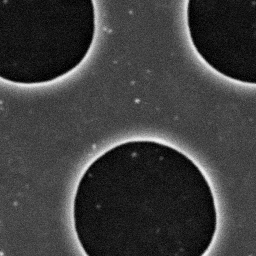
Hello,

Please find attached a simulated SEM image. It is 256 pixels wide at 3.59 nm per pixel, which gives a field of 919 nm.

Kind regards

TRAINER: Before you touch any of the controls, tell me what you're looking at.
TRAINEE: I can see holes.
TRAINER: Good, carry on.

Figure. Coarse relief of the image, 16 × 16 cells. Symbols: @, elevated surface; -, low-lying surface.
------@@@@@@----
------@@@@@@----
------@@@@@@----
-----@@@@@@@@---
----@@@@@@@@@@--
@@@@@@@@@@@@@@@@
@@@@@@@@@@@@@@@@
@@@@@@@@@@@@@@@@
@@@@@@@@@@@@@@@@
@@@@@@@----@@@@@
@@@@@-------@@@@
@@@@@--------@@@
@@@@@--------@@@
@@@@@---------@@
@@@@@--------@@@
@@@@@--------@@@